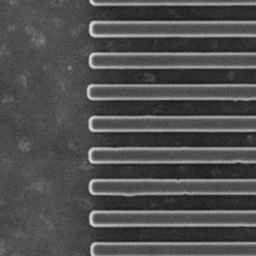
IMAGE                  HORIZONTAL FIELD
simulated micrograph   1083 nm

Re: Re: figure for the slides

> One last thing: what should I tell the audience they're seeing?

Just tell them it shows parallel lines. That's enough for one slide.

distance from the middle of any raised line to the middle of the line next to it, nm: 134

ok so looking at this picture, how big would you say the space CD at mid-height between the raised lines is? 69.3 nm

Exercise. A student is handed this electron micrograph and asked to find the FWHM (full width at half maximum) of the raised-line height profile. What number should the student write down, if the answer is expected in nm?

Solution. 65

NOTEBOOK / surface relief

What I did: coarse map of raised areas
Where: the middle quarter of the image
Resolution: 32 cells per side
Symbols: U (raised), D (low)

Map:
DDDDDDDUUUUUUUUUUUUUUUUUUUUUUUUU
DDDDDDDDDDDDDDDDDDDDDDDDDDDDDDDD
DDDDDDDDDDDDDDDDDDDDDDDDDDDDDDDD
DDDDDDDDDDDDDDDDDDDDDDDDDDDDDDDD
DDDDDDDDDDDDDDDDDDDDDDDDDDDDDDDD
DDDDDDUUUUUUUUUUUUUUUUUUUUUUUUUU
DDDDDDUUUUUUUUUUUUUUUUUUUUUUUUUU
DDDDDDUUUUUUUUUUUUUUUUUUUUUUUUUU
DDDDDDUUUUUUUUUUUUUUUUUUUUUUUUUU
DDDDDDDDDDDDDDDDDDDDDDDDDDDDDDDD
DDDDDDDDDDDDDDDDDDDDDDDDDDDDDDDD
DDDDDDDDDDDDDDDDDDDDDDDDDDDDDDDD
DDDDDDDDDDDDDDDDDDDDDDDDDDDDDDDD
DDDDDDDUUUUUUUUUUUUUUUUUUUUUUUUU
DDDDDDUUUUUUUUUUUUUUUUUUUUUUUUUU
DDDDDDUUUUUUUUUUUUUUUUUUUUUUUUUU
DDDDDDDUUUUUUUUUUUUUUUUUUUUUUUUU
DDDDDDDDDDDDDDDDDDDDDDDDDDDDDDDD
DDDDDDDDDDDDDDDDDDDDDDDDDDDDDDDD
DDDDDDDDDDDDDDDDDDDDDDDDDDDDDDDD
DDDDDDDDDDDDDDDDDDDDDDDDDDDDDDDD
DDDDDDDUUUUUUUUUUUUUUUUUUUUUUUUU
DDDDDDDUUUUUUUUUUUUUUUUUUUUUUUUU
DDDDDDDUUUUUUUUUUUUUUUUUUUUUUUUU
DDDDDDDUUUUUUUUUUUUUUUUUUUUUUUUU
DDDDDDDDDDDDDDDDDDDDDDDDDDDDDDDD
DDDDDDDDDDDDDDDDDDDDDDDDDDDDDDDD
DDDDDDDDDDDDDDDDDDDDDDDDDDDDDDDD
DDDDDDDDDDDDDDDDDDDDDDDDDDDDDDDD
DDDDDDDUUUUUUUUUUUUUUUUUUUUUUUUU
DDDDDDDUUUUUUUUUUUUUUUUUUUUUUUUU
DDDDDDDUUUUUUUUUUUUUUUUUUUUUUUUU